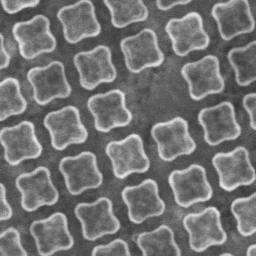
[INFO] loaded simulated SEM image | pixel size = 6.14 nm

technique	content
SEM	a regular array of raised bodies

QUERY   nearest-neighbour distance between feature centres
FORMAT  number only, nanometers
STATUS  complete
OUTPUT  289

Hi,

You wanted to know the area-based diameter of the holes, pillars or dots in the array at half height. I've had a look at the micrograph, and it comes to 0.233 µm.